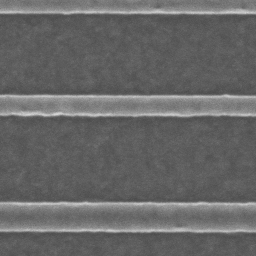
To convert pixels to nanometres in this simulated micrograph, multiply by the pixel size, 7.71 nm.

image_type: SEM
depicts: one or a few lines or trenches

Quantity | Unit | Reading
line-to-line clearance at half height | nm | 655